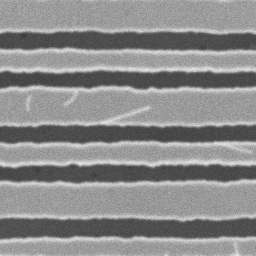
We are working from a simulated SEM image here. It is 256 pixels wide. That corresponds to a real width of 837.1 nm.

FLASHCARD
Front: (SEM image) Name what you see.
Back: lines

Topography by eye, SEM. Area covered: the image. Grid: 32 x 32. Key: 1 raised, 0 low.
11111111111111111111111111111111
11111111111111111111111111111111
11111111111111111111111111111111
11111111111111111111111111111111
00000000000000000000000000000000
00000000000000000000000000000000
11111111111111111111111111111111
11111111111111111111111111111111
11111111111111111111111111111111
00000000000000000000000000000000
00000000000000000000000000000000
11111111111111111111111111111111
11111111111111111111111111111111
11111111111111111111111111111111
11111111111111111111111111111111
11111001111101111111111111111111
00000000000000000000000000000000
00000000000000000000000000000000
11111111111111111111111111111111
11111111111111111111111111111111
11111111111100111111111111111111
00000000000000000000000000000000
00000000000000000000000000000000
11111111111111111111111111111111
11111111111111111111111111111111
11111111111111111111111111111111
11111111111111111111111111111111
00000000000000000000001100000000
00000000000000000000000000000000
00000000000000000000000000000000
11111111111111111111111111111111
11111111111111111111111111111111